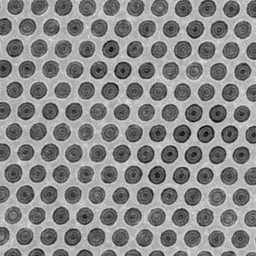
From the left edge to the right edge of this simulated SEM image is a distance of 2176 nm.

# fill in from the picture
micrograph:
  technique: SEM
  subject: a regular array of ring-shaped grooves with a dot in the middle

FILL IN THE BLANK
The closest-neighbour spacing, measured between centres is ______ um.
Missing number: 0.201